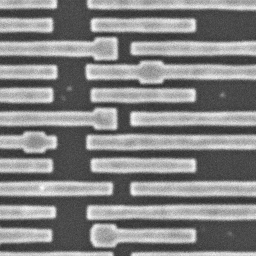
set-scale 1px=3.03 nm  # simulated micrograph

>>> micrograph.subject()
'wiring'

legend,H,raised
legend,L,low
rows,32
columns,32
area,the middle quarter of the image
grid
LLLLLLHHHHHHHHHHLLHHHHHHHHHHHHHH
LLLLLLHHHHHHHHHHHHHHHHHHHHHHHHHH
LLLLLLHHHHHHHHHHHHHHHHHHHHHHHHHH
LLLLLLHHHHHHHHHHHHHHHHHHHHHHHHHH
LLLLLLLLLLLLLLLLLLLHHHHHHLLLLLLL
LLLLLLLLLLLLLLLLLLLLLLLLLLLLLLLL
LLLLLLLHHHHHHHHHHHHHHHHHHHHHHHHH
LLLLLLLHHHHHHHHHHHHHHHHHHHHHHHHH
LLLLLLLHHHHHHHHHHHHHHHHHHHHHHHHH
LLLLLLLLLLLLLLLHHHHLLLLLLLLLLLLL
LLLLLLLLLLLLLLLLLLLLLLLLLLLLLLLL
LLLLLLLLHHHHHLLLLLLLLLLLLLLLLLLL
HHHHHHHHHHHHHLLLLHHHHHHHHHHHHHHH
HHHHHHHHHHHHHLLLLHHHHHHHHHHHHHHH
HHHHHHHHHHHHHLLLLHHHHHHHHHHHHHHH
LLLLLLLHHHHHHLLLLLLLLLLLLLLLLLLL
LLLLLLLLLLLLLLLLLLLLLLLLLLLLLLLL
LLLLLLLLLLLLLLLLLLLLLLLLLLLLLLLL
LLLLLLHHHHHHHHHHHHHHHHHHHHHHHHHH
LLLLLLHHHHHHHHHHHHHHHHHHHHHHHHHH
LLLLLLHHHHHHHHHHHHHHHHHHHHHHHHHH
LLLLLLLLLLLLLLLLLLLLLLLLLLLLLLLL
LLLLLLLLLLLLLLLLLLLLLLLLLLLLLLLL
LLLLLLLLLLLLLLLLLLLLLLLLLLLLLLLL
LLLLLLLHHHHHHHHHHHHHHHHHHHHHHHHH
LLLLLLLHHHHHHHHHHHHHHHHHHHHHHHHH
LLLLLLLHHHHHHHHHHHHHHHHHHHHHHHHH
LLLLLLLLLLLLLLLLLLLLLLLLLLLLLLLL
LLLLLLLLLLLLLLLLLLLLLLLLLLLLLLLL
LLLLLLLLLLLLLLLLLLLLLLLLLLLLLLLL
HHHHHHHHHHHHLLLLLHHHHHHHHHHHHHHH
HHHHHHHHHHHHLLLLLHHHHHHHHHHHHHHH